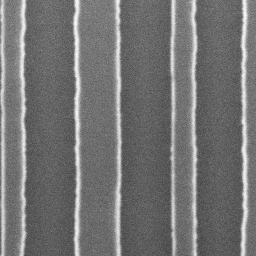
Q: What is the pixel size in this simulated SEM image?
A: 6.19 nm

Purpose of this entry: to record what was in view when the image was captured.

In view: lines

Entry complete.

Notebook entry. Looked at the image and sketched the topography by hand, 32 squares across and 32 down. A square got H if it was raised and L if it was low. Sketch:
HHHLLLLLLLHHHHHLLLLLLLHHLLLLLLLH
HHHLLLLLLLHHHHHLLLLLLLHHLLLLLLLH
HHHLLLLLLHHHHHHLLLLLLLHHLLLLLLLH
HHHLLLLLLHHHHHHLLLLLLLHHLLLLLLHH
HHHLLLLLLHHHHHHLLLLLLLHHHLLLLLHH
HHHLLLLLLLHHHHHLLLLLLHHHHLLLLLHH
HHHLLLLLLLHHHHHLLLLLLHHHHLLLLLHH
HHHLLLLLLHHHHHHLLLLLLHHHLLLLLLHH
HHHLLLLLLHHHHHHLLLLLLHHHLLLLLLHH
HHHLLLLLLLHHHHHLLLLLLLHHLLLLLLHH
HHHLLLLLLLHHHHHLLLLLLLHHLLLLLLHH
HHHLLLLLLLHHHHHLLLLLLLHHLLLLLLHH
HHHLLLLLLLHHHHHLLLLLLLHHLLLLLLHH
HHHLLLLLLLHHHHHLLLLLLLHHLLLLLLHH
HHHLLLLLLLHHHHHLLLLLLLHHLLLLLLHH
HHHLLLLLLLHHHHHLLLLLLLHHLLLLLLHH
HHHLLLLLLLHHHHHLLLLLLLHHLLLLLLHH
HHHLLLLLLLHHHHHLLLLLLLHHLLLLLLLH
HHHLLLLLLLHHHHHLLLLLLLHHHLLLLLHH
HHHLLLLLLLHHHHHLLLLLLLHHHLLLLLHH
HHHLLLLLLLHHHHHLLLLLLLHHHLLLLLLH
HHHLLLLLLLHHHHHLLLLLLLHHLLLLLLLH
HHHLLLLLLLHHHHHLLLLLLLHHLLLLLLLH
HHHLLLLLLLHHHHHLLLLLLLHHLLLLLLLH
HHHLLLLLLLHHHHHLLLLLLLHHLLLLLLLH
HHHLLLLLLLHHHHHLLLLLLLHHLLLLLLLH
HHHLLLLLLLHHHHHLLLLLLLHHLLLLLLLH
HHHLLLLLLLHHHHHLLLLLLLHHHLLLLLLH
HHHLLLLLLLHHHHHLLLLLLLHHLLLLLLHH
HHHLLLLLLHHHHHHLLLLLLLHHHLLLLLHH
HHHLLLLLLHHHHHHLLLLLLLHHLLLLLLHH
HHHLLLLLLLHHHHHLLLLLLLHHHLLLLLHH